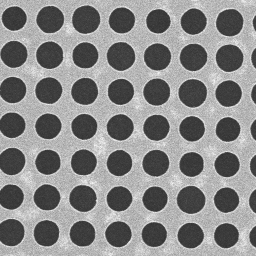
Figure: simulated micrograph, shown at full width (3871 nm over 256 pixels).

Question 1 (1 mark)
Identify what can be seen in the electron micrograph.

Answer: a regular array of holes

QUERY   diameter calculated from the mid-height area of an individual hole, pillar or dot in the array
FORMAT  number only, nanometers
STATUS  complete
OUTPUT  400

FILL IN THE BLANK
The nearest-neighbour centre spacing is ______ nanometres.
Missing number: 536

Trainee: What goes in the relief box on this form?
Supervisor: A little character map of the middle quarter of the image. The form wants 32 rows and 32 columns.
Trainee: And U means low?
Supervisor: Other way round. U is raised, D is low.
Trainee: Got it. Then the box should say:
UUUDDDDUUUUUDDDDDUUUUDDDDDUUUUDD
UUUUUUUUUUUUUDDDUUUUUUUDDUUUUUUD
UUUUUUUUUUUUUUUUUUUUUUUUUUUUUUUU
UUUUDDUUUUUUUUUUUUUUUUUUUUUUUUUU
UUUDDDDDUUUUDDDDUUUUUDDDDDUUUUDD
UUDDDDDDUUUDDDDDDUUUDDDDDDUUUDDD
UUDDDDDDDUUDDDDDDDUUDDDDDDDUUDDD
UUDDDDDDDUUDDDDDDUUUDDDDDDDUUDDD
UUDDDDDDUUUDDDDDDUUUDDDDDDUUUDDD
UUUDDDDUUUUUDDDDUUUUUDDDDDUUUDDD
UUUUUUUUUUUUUUUUUUUUUUUUUUUUUUDD
UUUUUUUUUUUUUUUUUUUUUUUUUUUUUUUU
UUUUDDUUUUUUUUDUUUUUUUUUUUUUUUUU
UUUDDDDUUUUUDDDDUUUUUDDDDUUUUUDD
UUDDDDDDUUUDDDDDDUUUDDDDDDUUUDDD
UUDDDDDDUUUDDDDDDDUUDDDDDDUUUDDD
UUDDDDDDUUUDDDDDDUUUDDDDDDUUUDDD
UUDDDDDDUUUDDDDDDUUUDDDDDDUUUDDD
UUUDDDDUUUUUDDDDUUUUUDDDDUUUUUDD
UUUUUUUUUUUUUUUUUUUUUUUUUUUUUUUU
UUUUUUUUUUUUUUUUUUUUUUUUUUUUUUUU
UUUUDDUUUUUUUUUUUUUUUUDDUUUUUUUU
UUDDDDDUUUUUDDDDUUUUDDDDDDUUUUDD
UUDDDDDDUUUDDDDDDUUUDDDDDDUUUDDD
UUDDDDDDUUUDDDDDDUUUDDDDDDUUUDDD
UUDDDDDDUUUDDDDDDUUUDDDDDDUUUDDD
UUDDDDDDUUUDDDDDDUUUDDDDDDUUUDDD
UUUDDDDUUUUUDDDUUUUUUDDDDUUUUUDD
UUUUUUUUUUUUUUUUUUUUUUUUUUUUUUUU
UUUUUUUUUUUUUUUUUUUUUUUUUUUUUUUU
UUUDDDUUUUUUUDUUUUUUUUUUUUUUUUUD
UUDDDDDUUUUUDDDDUUUUUDDDDUUUUDDD